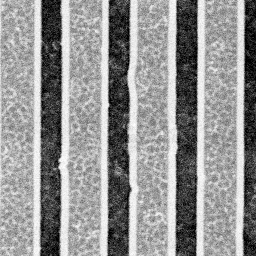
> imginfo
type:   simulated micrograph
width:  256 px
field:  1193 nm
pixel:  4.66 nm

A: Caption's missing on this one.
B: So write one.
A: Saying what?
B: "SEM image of one or a few lines or trenches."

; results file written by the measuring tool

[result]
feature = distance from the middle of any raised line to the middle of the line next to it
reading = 0.316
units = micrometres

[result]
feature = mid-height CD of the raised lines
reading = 186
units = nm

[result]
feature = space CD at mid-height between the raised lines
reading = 130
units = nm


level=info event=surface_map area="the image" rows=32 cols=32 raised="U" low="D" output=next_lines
UUUUUDDDUUUUUDDDDUUUUUDDDUUUUUDD
UUUUUDDDUUUUUDDDDUUUUUDDDUUUUUDD
UUUUUDDDUUUUUDDDDUUUUUDDDUUUUUDD
UUUUUDDDUUUUUDDDDUUUUUDDDUUUUUDD
UUUUUDDDUUUUUDDDDUUUUUDDDUUUUUDD
UUUUUDDDUUUUUDDDDUUUUUDDDUUUUUDD
UUUUUDDDUUUUUDDDDUUUUUDDDUUUUUDD
UUUUUDDDUUUUUDDDDUUUUUDDDUUUUUDD
UUUUUDDDUUUUUDDDDUUUUUDDDUUUUUDD
UUUUUDDDUUUUUDDDUUUUUUDDDUUUUUDD
UUUUUDDDUUUUUDDDUUUUUUDDDUUUUUDD
UUUUUDDDUUUUUDDDDUUUUDDDDUUUUUDD
UUUUUDDDUUUUUDDDDUUUUDDDDUUUUUDD
UUUUUDDDUUUUUDDDDUUUUDDDDUUUUUDD
UUUUUDDDUUUUUDDDDUUUUDDDDUUUUUDD
UUUUUDDDUUUUUDDDDUUUUUDDDUUUUUDD
UUUUUDDDUUUUUDDDUUUUUUDDDUUUUUDD
UUUUUDDDUUUUUDDDUUUUUUDDDUUUUUDD
UUUUUDDDUUUUUDDDUUUUUUDDDUUUUUDD
UUUUUDDDUUUUUDDDDUUUUUDDDUUUUUDD
UUUUUDDDUUUUUDDDDUUUUDDDDUUUUUDD
UUUUUDDDUUUUUDDDDUUUUDDDDUUUUUDD
UUUUUDDDUUUUUDDDDUUUUDDDDUUUUUDD
UUUUUDDDUUUUUDDDDUUUUUDDDUUUUUDD
UUUUUDDDUUUUUDDDDUUUUDDDDUUUUUDD
UUUUUDDDUUUUUDDDDUUUUDDDDUUUUUDD
UUUUUDDDUUUUUDDDDUUUUDDDDUUUUUDD
UUUUUDDDUUUUUDDDDUUUUDDDDUUUUUDD
UUUUUDDDUUUUUDDDDUUUUDDDDUUUUUDD
UUUUUDDDUUUUUDDDDUUUUDDDDUUUUUDD
UUUUUDDDUUUUUDDDDUUUUDDDDUUUUUDD
UUUUUDDDUUUUUDDDDUUUUDDDDUUUUUDD